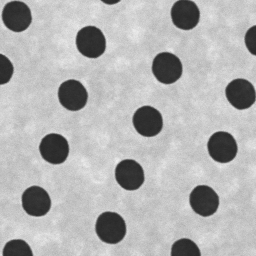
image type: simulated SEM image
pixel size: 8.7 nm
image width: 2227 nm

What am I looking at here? a regular array of holes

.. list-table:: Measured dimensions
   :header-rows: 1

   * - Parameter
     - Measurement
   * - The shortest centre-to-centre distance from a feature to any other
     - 489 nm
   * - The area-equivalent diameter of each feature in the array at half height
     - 265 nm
